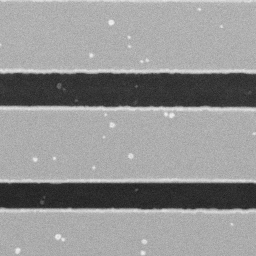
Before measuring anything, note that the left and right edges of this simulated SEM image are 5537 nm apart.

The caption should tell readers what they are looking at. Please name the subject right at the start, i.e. lines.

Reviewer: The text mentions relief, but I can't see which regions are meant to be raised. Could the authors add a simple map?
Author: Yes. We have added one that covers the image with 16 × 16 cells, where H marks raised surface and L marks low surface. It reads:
HHHHHHHHHHHHHHHH
HHHHHHHHHHHHHHHH
HHHHHHHHHHHHHHHH
HHHHHHHHHHHHHHHH
HHHHHHHHHHHHHHHH
LLLLLLLLLLLLLLLL
LLLLLLLLLLLLLLLL
HHHHHHHHHHHHHHHH
HHHHHHHHHHHHHHHH
HHHHHHHHHHHHHHHH
HHHHHHHHHHHHHHHH
LLLLLLLLLLLLLLLL
LLLLLLLLLLLLLLLL
HHHHHHHHHHHHHHHH
HHHHHHHHHHHHHHHH
HHHHHHHHHHHHHHHH